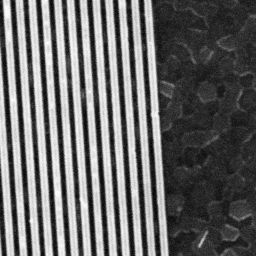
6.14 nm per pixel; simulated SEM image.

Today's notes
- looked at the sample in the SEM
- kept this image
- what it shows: parallel lines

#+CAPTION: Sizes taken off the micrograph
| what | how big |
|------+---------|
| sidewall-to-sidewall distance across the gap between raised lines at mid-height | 46.7 nm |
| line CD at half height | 35.2 nm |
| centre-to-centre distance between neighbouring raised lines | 0.0786 um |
